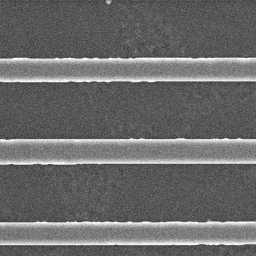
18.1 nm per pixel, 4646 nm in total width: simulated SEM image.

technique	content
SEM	lines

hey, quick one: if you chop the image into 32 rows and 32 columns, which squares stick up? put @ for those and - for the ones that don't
--------------------------------
--------------------------------
--------------------------------
--------------------------------
--------------------------------
--------------------------------
--------------------------------
@@@@@@@@@@@@@@@@@@@@@@@@@@@@@@@@
@@@@@@@@@@@@@@@@@@@@@@@@@@@@@@@@
@@@@@@@@@@@@@@@@@@@@@@@@@@@@@@@@
--------------------------------
--------------------------------
--------------------------------
--------------------------------
--------------------------------
--------------------------------
--------------------------------
@@@@@@@@@@@@@@@@@@@@@@@@@@@@@@@@
@@@@@@@@@@@@@@@@@@@@@@@@@@@@@@@@
@@@@@@@@@@@@@@@@@@@@@@@@@@@@@@@@
--------------------------------
--------------------------------
--------------------------------
--------------------------------
--------------------------------
--------------------------------
--------------------------------
--------------------------------
@@@@@@@@@@@@@@@@@@@@@@@@@@@@@@@@
@@@@@@@@@@@@@@@@@@@@@@@@@@@@@@@@
@@@@@@@@@@@@@@@@@@@@@@@@@@@@@@@-
--------------------------------